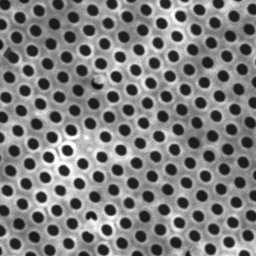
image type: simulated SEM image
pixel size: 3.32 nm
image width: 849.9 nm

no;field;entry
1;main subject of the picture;a regular array of holes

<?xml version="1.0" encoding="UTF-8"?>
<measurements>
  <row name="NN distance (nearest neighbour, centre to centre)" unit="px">20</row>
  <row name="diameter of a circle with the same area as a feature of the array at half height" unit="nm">39.1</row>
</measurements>